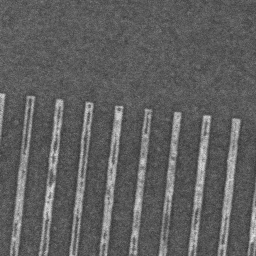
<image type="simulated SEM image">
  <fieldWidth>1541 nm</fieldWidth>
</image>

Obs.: parallel lines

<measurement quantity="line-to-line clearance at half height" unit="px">22.6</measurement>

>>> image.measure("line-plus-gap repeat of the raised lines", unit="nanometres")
178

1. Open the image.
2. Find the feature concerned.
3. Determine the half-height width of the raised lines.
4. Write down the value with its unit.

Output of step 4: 6.59 px